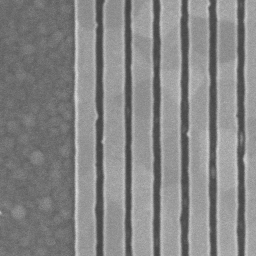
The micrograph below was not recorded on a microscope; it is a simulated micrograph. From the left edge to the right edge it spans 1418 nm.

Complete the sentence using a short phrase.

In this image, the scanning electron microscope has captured parallel lines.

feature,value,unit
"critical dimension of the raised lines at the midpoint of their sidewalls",107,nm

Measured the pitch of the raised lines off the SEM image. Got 0.157 micrometres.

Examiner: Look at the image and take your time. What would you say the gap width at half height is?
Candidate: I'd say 45.7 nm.